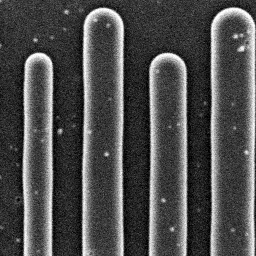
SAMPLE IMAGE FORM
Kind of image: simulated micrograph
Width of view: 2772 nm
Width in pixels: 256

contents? groups of lines, slits or small figures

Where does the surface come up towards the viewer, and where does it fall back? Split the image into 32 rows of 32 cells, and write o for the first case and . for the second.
................................
............oo..............ooo.
...........oooo............ooooo
...........oooo...........oooooo
...........oooo...........oooooo
...........oooo...........oooooo
...........oooo...........oooooo
...ooo.....oooo....oooo...oooooo
...ooo.....oooo....oooo...oooooo
...ooo.....oooo....oooo...oooooo
...ooo.....oooo....oooo...oooooo
...ooo.....oooo....oooo...oooooo
...ooo.....oooo....oooo....ooooo
...ooo.....oooo....oooo...oooooo
...ooo.....oooo....oooo...oooooo
...ooo.....oooo....oooo...oooooo
...ooo.....oooo....oooo...oooooo
...ooo.....oooo....oooo...oooooo
...ooo.....oooo....oooo...oooooo
...ooo....ooooo....oooo...oooooo
...ooo....ooooo....oooo...oooooo
...ooo....ooooo....oooo...oooooo
...ooo....ooooo....oooo...oooooo
...ooo....ooooo....oooo...oooooo
...ooo....ooooo....oooo....ooooo
...ooo....ooooo....oooo....ooooo
...ooo....ooooo....oooo....ooooo
...ooo....ooooo....oooo...oooooo
...ooo....ooooo....oooo...oooooo
...ooo....ooooo....oooo...oooooo
...ooo....ooooo....oooo...oooooo
...ooo....ooooo....oooo...oooooo